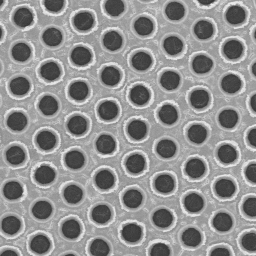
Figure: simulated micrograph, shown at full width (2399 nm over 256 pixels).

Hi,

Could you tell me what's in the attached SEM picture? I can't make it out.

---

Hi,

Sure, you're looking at a regular array of holes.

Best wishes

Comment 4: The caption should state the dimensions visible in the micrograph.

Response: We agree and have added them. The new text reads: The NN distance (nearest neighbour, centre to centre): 0.32 micrometres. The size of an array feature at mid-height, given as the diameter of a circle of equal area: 0.205 micrometres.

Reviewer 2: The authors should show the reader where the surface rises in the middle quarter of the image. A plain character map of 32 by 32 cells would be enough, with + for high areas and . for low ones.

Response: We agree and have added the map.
+++...++++...++++.....++++++++++
+++++++++.....++++...+++++++++++
+++++++++......+++++++++.....+++
+++++++++.....++++++++++.....+++
++...++++.....++++++++++.....+++
+.....+++++..++++...++++.....+++
+.....++++++++++.....++++...++++
+.....++++++++++......+++++++++.
++....++++++++++......+++++++++.
+++.+++++....++++....++++++++++.
+++++++++.....++++..++++....++++
++++++++......+++++++++.....++++
++++++++......+++++++++......+++
+.....+++....++++++++++......+++
+.....++++++++++.....+++....++++
......++++++++++.....++++++++++.
+.....++++++++++.....++++++++++.
++...++++..+++++.....++++++++++.
++++++++.....++++...+++++.+++++.
++++++++.....++++++++++.....++++
++++++++.....++++++++++.....++++
++..++++.....++++++++++.....++++
.....++++...+++++...+++.....++++
......+++++++++.....++++...+++++
......+++++++++......++++++++++.
.....++++++++++......+++++++++..
++..+++++...++++....++++++++++..
++++++++....+++++..+++++...+++..
+++++++......++++++++++.....+++.
++++++++.....+++++++++......++++
....++++.....+++++++++......++++
.....++++..+++++...++++.....++++